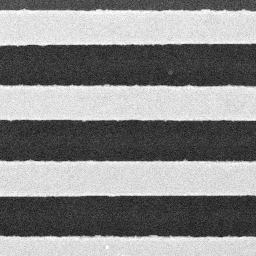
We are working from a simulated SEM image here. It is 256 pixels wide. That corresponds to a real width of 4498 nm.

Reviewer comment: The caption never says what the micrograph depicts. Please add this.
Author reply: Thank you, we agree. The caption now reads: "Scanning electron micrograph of lines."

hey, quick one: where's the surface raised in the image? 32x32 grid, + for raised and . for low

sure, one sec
................................
++++++++++++++++++++++++++++++++
++++++++++++++++++++++++++++++++
++++++++++++++++++++++++++++++++
++++++++++++++++++++++++++++++++
+++++++++++++++++++++.+...+.....
................................
................................
................................
................................
................................
++++++++++++++++++++++++++++++++
++++++++++++++++++++++++++++++++
++++++++++++++++++++++++++++++++
++++++++++++++++++++++++++++++++
................................
................................
................................
................................
................................
++++++++++++++++++++++++++++++++
++++++++++++++++++++++++++++++++
++++++++++++++++++++++++++++++++
++++++++++++++++++++++++++++++++
................................
................................
................................
................................
................................
................................
++++++++++++++++++++++++++++++++
++++++++++++++++++++++++++++++++